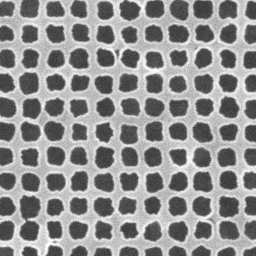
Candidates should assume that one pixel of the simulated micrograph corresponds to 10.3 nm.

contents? a regular array of holes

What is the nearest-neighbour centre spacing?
0.243 µm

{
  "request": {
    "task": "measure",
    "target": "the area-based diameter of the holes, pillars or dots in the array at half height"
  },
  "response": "204 nm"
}